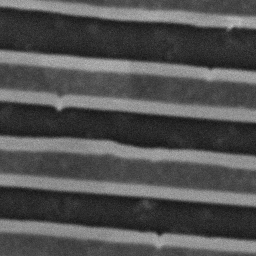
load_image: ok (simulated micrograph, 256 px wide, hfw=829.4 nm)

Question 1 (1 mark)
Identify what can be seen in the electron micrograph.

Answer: one or a few lines or trenches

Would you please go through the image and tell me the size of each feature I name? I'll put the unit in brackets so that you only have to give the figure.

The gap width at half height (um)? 0.151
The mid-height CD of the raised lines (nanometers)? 126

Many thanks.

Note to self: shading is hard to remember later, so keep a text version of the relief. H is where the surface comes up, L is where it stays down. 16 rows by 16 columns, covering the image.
LLLLHHHHHHHHHHHH
LLLLLLLLLLLLLLLL
LLLLLLLLLLLLLLLL
LLLLLLLLLLLLLLLL
HHHHHHHHHHHHLLLL
HHHHHHHHHHHHHHHH
LLLLLLLHHHHHHHHH
LLLLLLLLLLLLLLLL
LLLLLLLLLLLLLLLL
HHHHHHHHLLLLLLLL
HHHHHHHHHHHHHHHH
LLLHHHHHHHHHHHHH
LLLLLLLLLLLLLLLH
LLLLLLLLLLLLLLLL
HHHHHLLLLLLLLLLL
HHHHHHHHHHHHHHHH